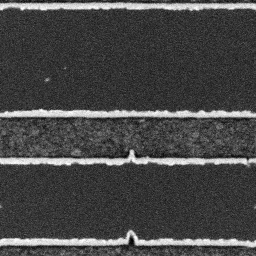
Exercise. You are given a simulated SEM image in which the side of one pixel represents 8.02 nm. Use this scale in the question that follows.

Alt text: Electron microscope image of one or a few lines or trenches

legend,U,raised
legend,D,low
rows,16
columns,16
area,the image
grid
UUUUUUUUUUUUUUUU
UUUUUUUUUUUUUUUU
UUUUUUUUUUUUUUUU
UUUUUUUUUUUUUUUU
UUUUUUUUUUUUUUUU
UUUUUUUUUUUUUUUU
UUUUUUUUUUUUUUUU
DDDDDDDDDDDDDDDD
DDDDDDDDDDDDDDDD
DDDDDDDDDDDDDDDD
UUUUUUUUUUUUUUUU
UUUUUUUUUUUUUUUU
UUUUUUUUUUUUUUUU
UUUUUUUUUUUUUUUU
UUUUUUUUUUUUUUUU
DDDDDDDDDDDDDDDD